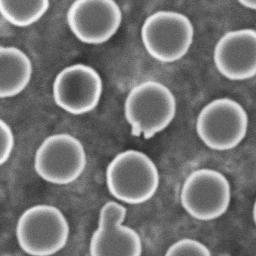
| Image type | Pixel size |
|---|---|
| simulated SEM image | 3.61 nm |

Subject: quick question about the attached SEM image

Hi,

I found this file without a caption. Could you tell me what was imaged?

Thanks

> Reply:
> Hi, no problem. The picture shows raised bodies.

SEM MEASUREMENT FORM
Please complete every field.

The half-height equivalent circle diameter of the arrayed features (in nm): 177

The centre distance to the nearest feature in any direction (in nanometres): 259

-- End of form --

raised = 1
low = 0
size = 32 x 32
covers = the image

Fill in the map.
11111100011111000000000000000011
11111000011111100000000000000000
01110000011111100001111000000000
00000000011111100011111100000000
00000000001111000011111100001111
00000000000000000011111100011111
11100000000000000001111000011111
11110000000000000000110000011111
11110000011000000000000000011111
11110001111100000000000000001110
11100001111110000011000000000000
11000001111100000111100000000000
00000001111100001111110000000000
00000000111000001111110000111100
00000000000000001111110001111110
00000000000000001111100001111110
10000000000000000111000001111110
10000011100000000000000001111100
10000111110000000000000000011000
10000111110000011100000000000000
00001111111000111110000000000000
00000111110001111111000001100000
00000011100000111111000111110000
00000000000000111110000111111000
00000000000000111110000111111000
00000000000001100000000111110000
00011110000001110000000011110000
00011111000011100000000000000000
00111111000011110000000000000000
00111111000011111000000000000000
00011111000111111000001110000000
00011110000111111000011111000000